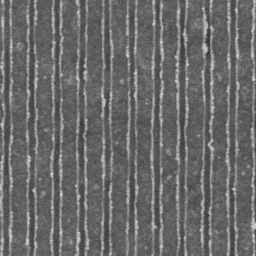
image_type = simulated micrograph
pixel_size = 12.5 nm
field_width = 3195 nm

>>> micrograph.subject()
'parallel lines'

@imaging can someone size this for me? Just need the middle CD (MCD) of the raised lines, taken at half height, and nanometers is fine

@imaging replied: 234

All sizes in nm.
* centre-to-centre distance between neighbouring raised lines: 313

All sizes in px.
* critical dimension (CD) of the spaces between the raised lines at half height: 6.87